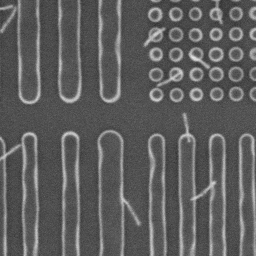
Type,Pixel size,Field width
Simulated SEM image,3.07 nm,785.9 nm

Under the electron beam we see groups of lines, slits or small figures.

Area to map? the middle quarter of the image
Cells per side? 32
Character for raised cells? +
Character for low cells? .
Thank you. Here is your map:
++++.....+++++..................
++++.....+++++........++...++...
++++.....+++++........+++..++...
++++.....+++++........++...++...
++++.....+++++..................
++++.....+++++..................
++++.....+++++........++...++...
++++.....+++++........+++..+++..
+++.......+++.........++...++...
................................
................................
................................
................................
................................
................................
................................
................................
+++......+++++................+.
++++.....+++++........+++....+++
++++.....+++++.......++++....+++
++++.....+++++.......++++....+++
++++.....+++++.......++++....+++
+++......+++++........+++....+++
+++......+++++........+++....+++
+++......+++++........+++....+++
+++......+++++........+++....+++
+++......+++++........+++....+++
+++......+++++........+++....+++
+++......+++++........+++....+++
+++......+++++........+++....+++
+++......+++++........+++....+++
++++.....+++++........+++....+++